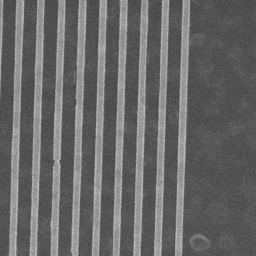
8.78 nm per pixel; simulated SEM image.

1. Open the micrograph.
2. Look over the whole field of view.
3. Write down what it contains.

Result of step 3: parallel lines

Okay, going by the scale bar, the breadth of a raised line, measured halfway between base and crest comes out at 60.3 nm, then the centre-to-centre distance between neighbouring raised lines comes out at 20.7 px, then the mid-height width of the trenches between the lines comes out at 0.121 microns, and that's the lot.